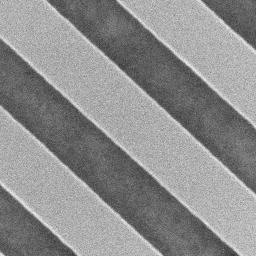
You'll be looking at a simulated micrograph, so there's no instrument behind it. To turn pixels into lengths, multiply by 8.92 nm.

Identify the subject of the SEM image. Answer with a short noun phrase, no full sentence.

lines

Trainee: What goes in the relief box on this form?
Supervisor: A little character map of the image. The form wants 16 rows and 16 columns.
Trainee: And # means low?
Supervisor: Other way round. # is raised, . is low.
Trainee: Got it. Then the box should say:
###.....#####...
####.....#####..
#####.....#####.
.######....#####
..######....####
...######....###
.....#####....##
#.....#####....#
##.....#####....
###.....#####...
####.....#####..
#####.....#####.
.#####.....#####
..#####.....####
...######....###
....######.....#